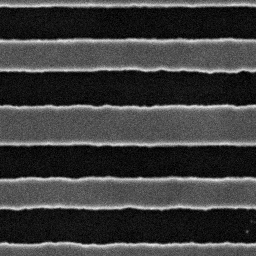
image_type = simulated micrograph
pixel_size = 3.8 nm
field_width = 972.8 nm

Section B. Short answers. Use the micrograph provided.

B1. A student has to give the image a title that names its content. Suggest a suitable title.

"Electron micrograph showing lines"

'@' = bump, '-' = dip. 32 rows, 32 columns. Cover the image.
@@@@@@@@@@@@@@@@@@@@@@@@@@@@@@@@
--------------------------------
--------------------------------
--------------------------------
--------------------------------
@@@@@@@@@@@@@@@@@@@@@@@@@@@@@@@@
@@@@@@@@@@@@@@@@@@@@@@@@@@@@@@@@
@@@@@@@@@@@@@@@@@@@@@@@@@@@@@@@@
@@@@@@@@@@@@@@@@@@@@@@@@@@@@@@@@
--------------------------------
--------------------------------
--------------------------------
--------------------------------
@@@@@@@@@@@@@@@@@@@@@@@@@@@@@@@@
@@@@@@@@@@@@@@@@@@@@@@@@@@@@@@@@
@@@@@@@@@@@@@@@@@@@@@@@@@@@@@@@@
@@@@@@@@@@@@@@@@@@@@@@@@@@@@@@@@
@@@@@@@@@@@@@@@@@@@@@@@@@@@@@@@@
--------------------------------
--------------------------------
--------------------------------
--------------------------------
@@@@@@@@@-@@@@@@@@@@@@@@@@@@@@@@
@@@@@@@@@@@@@@@@@@@@@@@@@@@@@@@@
@@@@@@@@@@@@@@@@@@@@@@@@@@@@@@@@
@@@@@@@@@@@@@@@@@@@@@@@@@@@@@@@@
--------------------------------
--------------------------------
--------------------------------
--------------------------------
@----@@@@@-------------@@---@---
@@@@@@@@@@@@@@@@@@@@@@@@@@@@@@@@